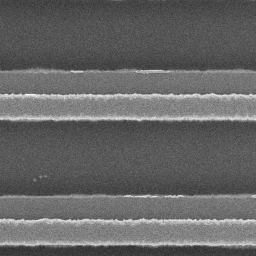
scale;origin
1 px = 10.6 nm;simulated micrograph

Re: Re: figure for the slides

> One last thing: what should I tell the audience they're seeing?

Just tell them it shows lines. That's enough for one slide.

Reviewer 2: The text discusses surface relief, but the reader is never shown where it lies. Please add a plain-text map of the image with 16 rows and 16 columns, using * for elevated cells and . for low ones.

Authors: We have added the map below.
................
................
................
................
....***.***.*.**
****************
****************
........*.......
................
................
................
................
****************
****************
****************
................